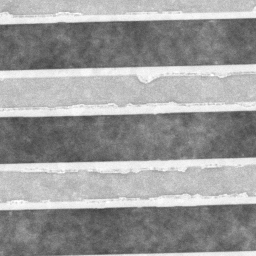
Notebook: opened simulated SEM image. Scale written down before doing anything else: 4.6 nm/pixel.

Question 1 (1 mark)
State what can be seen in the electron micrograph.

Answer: one or a few lines or trenches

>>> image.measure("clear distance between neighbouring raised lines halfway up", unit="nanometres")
248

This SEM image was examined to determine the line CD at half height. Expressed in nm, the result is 177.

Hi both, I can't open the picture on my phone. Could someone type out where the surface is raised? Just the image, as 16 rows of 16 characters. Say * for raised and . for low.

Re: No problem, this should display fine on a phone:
****************
................
................
................
.......*********
****************
****************
................
................
................
.***************
****************
***************.
................
................
................